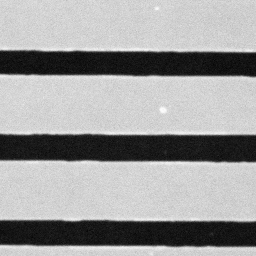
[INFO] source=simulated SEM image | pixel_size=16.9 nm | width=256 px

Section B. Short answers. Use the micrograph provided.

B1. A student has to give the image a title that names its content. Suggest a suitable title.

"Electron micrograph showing lines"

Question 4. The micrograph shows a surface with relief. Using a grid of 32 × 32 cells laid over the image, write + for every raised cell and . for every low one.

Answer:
++++++++++++++++++++++++++++++++
++++++++++++++++++++++++++++++++
++++++++++++++++++++++++++++++++
++++++++++++++++++++++++++++++++
++++++++++++++++++++++++++++++++
++++++++++++++++++++++++++++++++
................................
................................
................................
++..+...........................
++++++++++++++++++++++++++++++++
++++++++++++++++++++++++++++++++
++++++++++++++++++++++++++++++++
++++++++++++++++++++++++++++++++
++++++++++++++++++++++++++++++++
++++++++++++++++++++++++++++++++
++++++++++++++++++++++++++++++++
................................
................................
................................
++++++++++++++++++++++++++++++++
++++++++++++++++++++++++++++++++
++++++++++++++++++++++++++++++++
++++++++++++++++++++++++++++++++
++++++++++++++++++++++++++++++++
++++++++++++++++++++++++++++++++
++++++++++++++++++++++++++++++++
........++....++++++++++++++++++
................................
................................
................................
++++++++++++++++++++++++++++++++